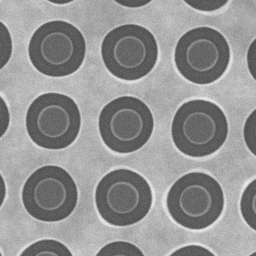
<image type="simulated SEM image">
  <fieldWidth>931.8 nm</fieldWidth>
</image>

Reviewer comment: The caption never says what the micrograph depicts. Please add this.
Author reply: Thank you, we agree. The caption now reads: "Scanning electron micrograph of an array of small figures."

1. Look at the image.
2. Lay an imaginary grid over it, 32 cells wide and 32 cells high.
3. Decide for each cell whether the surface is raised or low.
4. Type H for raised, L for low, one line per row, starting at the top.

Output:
HHHHHHHLHHHHHHHLLLHHHHHLLLLLLHHH
HHHHHHHHHHHHHHHHHHHHHHHHHLLHHHHH
HHHHHHHHHHHHHHHHHHHHHHHHHHHHHHHH
LHHHHLLLLLHHHHLLLLHHHHHHLLHHHHHH
LHHHLLLLLLHHHLLLLLLHHHHLLLLLHHHH
LHHHLLLLLLLHHLLLLLLLHHLLLLLLLHHL
LHHHLLLLLLLHHLLLLLLLHHLLLLLLLHHL
LHHHLLLLLLHHHLLLLLLLHHLLLLLLLHHL
HHHHLLLLLLHHHLLLLLLHHHLLLLLLLHHL
HHHHHHLLHHHHHHLLLLHHHHHLLLLLHHHL
HHHHHHHHHHHHHHHHHHHHHHHHHLHHHHHH
HHHHHHHHHHHHHHHHHHHHHHHHHHHHHHHH
LHHHLLLLLHHHHHLLLLHHHHHHLLHHHHHH
LHHHLLLLLLHHHLLLLLLHHHLLLLLLHHHH
LHHLLLLLLLHHLLLLLLLHHHLLLLLLHHHL
LHHLLLLLLLHHLLLLLLLHHLLLLLLLHHHL
LHHLLLLLLLHHLLLLLLLHHLLLLLLLLHLL
HHHHLLLLLHHHHLLLLLLHHHLLLLLLHHHL
HHHHHLLLHHHHHLLLLHHHHHLLLLLHHHHL
HHHHHHHHHHHHHHHHHHHHHHHLLLHHHHHH
HHHHHHHHHHHHHHHHHHHHHHHHHHHHHHHH
HHHHLLLLHHHHHHLLLHHHHHHHLLHHHHHH
HHHLLLLLLHHHHLLLLLHHHHLLLLLHHHHL
LHHLLLLLLLHHLLLLLLLHHLLLLLLLHHHL
LHHLLLLLLLHHLLLLLLLHHLLLLLLLHHLL
HHHLLLLLLLHHLLLLLLLHHLLLLLLLHHLL
HHHLLLLLLHHHLLLLLLLHHLLLLLLLHHLL
HHHHHLLLHHHHHLLLLLHHHHLLLLLHHHHL
HHHHHHHHHHHHHHHHHHHHHHHLLLHHHHHL
HHHHHHHHHHHHHHHHHHHHHHHHHHHHHHHH
HHHHLLLLHHHHHLLLHHHHHHHHHHHHHHHH
HHHLLLLLLHHHLLLLLLHHHHLLLLLHHHHH